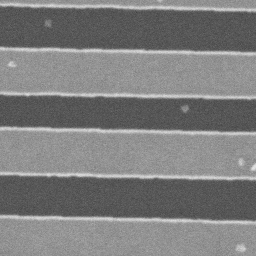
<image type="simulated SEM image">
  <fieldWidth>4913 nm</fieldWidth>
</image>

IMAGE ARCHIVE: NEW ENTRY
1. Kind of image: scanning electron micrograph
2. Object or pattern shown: lines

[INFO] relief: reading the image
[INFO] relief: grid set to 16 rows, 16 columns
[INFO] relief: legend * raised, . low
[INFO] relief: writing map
........*.******
................
................
****************
****************
****************
................
................
****************
****************
****************
................
................
................
****************
****************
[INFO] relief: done